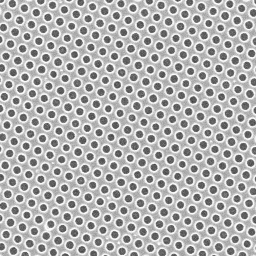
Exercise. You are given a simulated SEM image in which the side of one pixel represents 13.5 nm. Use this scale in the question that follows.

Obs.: a regular array of holes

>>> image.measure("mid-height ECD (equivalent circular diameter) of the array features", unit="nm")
110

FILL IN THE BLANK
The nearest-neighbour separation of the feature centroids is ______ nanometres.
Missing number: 170